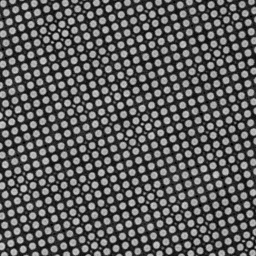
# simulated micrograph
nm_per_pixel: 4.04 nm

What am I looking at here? a regular array of raised bodies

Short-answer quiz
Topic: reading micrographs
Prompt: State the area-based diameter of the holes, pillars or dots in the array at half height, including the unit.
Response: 27 nm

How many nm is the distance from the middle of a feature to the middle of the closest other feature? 38.3